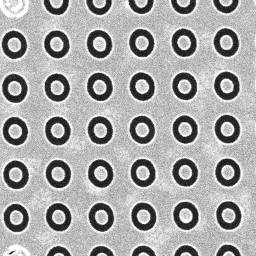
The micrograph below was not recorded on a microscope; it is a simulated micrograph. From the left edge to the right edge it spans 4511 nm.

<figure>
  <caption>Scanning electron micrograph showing a regular array of ring-shaped grooves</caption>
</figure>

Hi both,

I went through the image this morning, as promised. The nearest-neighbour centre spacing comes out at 745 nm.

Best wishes